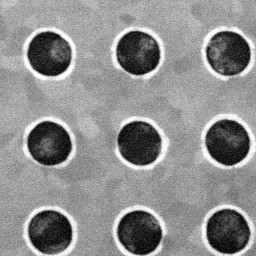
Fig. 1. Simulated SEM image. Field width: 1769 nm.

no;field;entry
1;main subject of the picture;a regular array of holes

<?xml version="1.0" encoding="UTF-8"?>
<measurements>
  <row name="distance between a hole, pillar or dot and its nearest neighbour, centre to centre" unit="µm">0.612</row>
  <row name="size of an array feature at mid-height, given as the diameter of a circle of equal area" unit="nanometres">315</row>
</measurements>